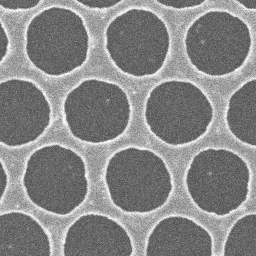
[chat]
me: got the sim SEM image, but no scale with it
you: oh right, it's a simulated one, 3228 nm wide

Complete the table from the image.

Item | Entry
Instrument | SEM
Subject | a regular array of holes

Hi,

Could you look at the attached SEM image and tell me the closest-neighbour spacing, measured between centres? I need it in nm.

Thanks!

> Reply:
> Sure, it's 1000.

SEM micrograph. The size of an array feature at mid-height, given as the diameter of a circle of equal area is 824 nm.